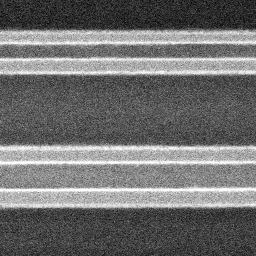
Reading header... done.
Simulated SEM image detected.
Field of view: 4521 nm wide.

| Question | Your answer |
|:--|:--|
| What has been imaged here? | lines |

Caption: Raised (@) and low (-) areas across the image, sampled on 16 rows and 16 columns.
----------------
----------------
@@@@@@@@@@@@@@@@
@@@@@@@@@@@@@@@@
----------------
----------------
----------------
----------------
----------------
@@@@@@@@@@@@@@@@
@@@@@@@@@@@@@@@@
@@@@@@@@@@@@@@@@
@@@@@@@@@@@@@@@@
----------------
----------------
----------------